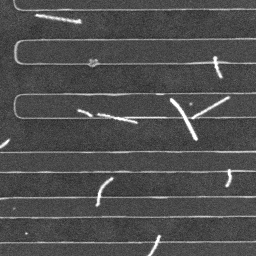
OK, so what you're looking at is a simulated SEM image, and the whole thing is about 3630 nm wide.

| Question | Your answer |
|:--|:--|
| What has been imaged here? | groups of lines, slits or small figures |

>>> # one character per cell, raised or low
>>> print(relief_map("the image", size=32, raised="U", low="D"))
DDUUUUUUUUUUUUUUUUUUUUUUUUUUUUUU
DDDDDDDDDDDDDDDDDDDDDDDDDDDDDDDD
DDDDDDDDDDDDDDDDDDDDDDDDDDDDDDDD
DDDDDDDDDDDDDDDDDDDDDDDDDDDDDDDD
DDDDDDDDDDDDDDDDDDDDDDDDDDDDDDDD
DDUUUUUUUUUUUUUUUUUUUUUUUUUUUUUU
DDUUUUUUUUUUUUUUUUUUUUUUUUUUUUUU
DDUUUUUUUUUUUUUUUUUUUUUUUUUUUUUU
DDDDDDDDDDDDDDDDDDDDDDDDDDDDDDDD
DDDDDDDDDDDDDDDDDDDDDDDDDDDDDDDD
DDDDDDDDDDDDDDDDDDDDDDDDDDDDDDDD
DDDDDDDDDDDDDDDDDDDDDDDDDDDDDDDD
DDUUUUUUUUUUUUUUUUUUUUUUUUUUUUUU
DDUUUUUUUUUUUUUUUUUUUUUUUUUUUUUU
DDUUUUUUUUUUUUUUUUUUUUUUUUUUUUUU
DDDDDDDDDDDDDDDDDDDDDDDDDDDDDDDD
DDDDDDDDDDDDDDDDDDDDDDDDDDDDDDDD
DDDDDDDDDDDDDDDDDDDDDDDDDDDDDDDD
DDDDDDDDDDDDDDDDDDDDDDDDDDDDDDDD
UUUUUUUUUUUUUUUUUUUUUUUUUUUUUUUU
UUUUUUUUUUUUUUUUUUUUUUUUUUUUUUUU
UDDDDDUUDDDDDDDDDDDDDDDDDDDDUDDD
DDDDDDDDDDDDDDDDDDDDDDDDDDDDDDDD
DDDDDDDDDDDDDDDDDDDDDDDDDDDDDDDD
DDDDDDDDDDDDDDDDDDDDDDDDDDDDDDDD
UUUUUUUUUUUUUUUUUUUUUUUUUUUUUUUU
UUUUUUUUUUUUUUUUUUUUUUUUUUUUUUUU
DDDDDDDDDDDDDDDDDDDDDDDDDDDDDDDD
DDDDDDDDDDDDDDDDDDDDDDDDDDDDDDDD
DDDDDDDDDDDDDDDDDDDDDDDDDDDDDDDD
UUUUUUUUUUUUUUUUUUUUUUUUUUUUUUUU
UUUUUUUUUUUUUUUUUUUUUUUUUUUUUUUU